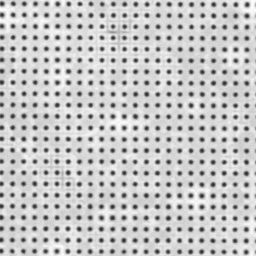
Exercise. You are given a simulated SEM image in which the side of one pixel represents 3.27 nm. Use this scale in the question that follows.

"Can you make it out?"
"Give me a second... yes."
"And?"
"a regular array of holes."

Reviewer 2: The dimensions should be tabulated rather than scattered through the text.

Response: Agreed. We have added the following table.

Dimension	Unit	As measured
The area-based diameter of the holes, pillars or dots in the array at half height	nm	14.3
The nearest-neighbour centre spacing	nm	35.8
